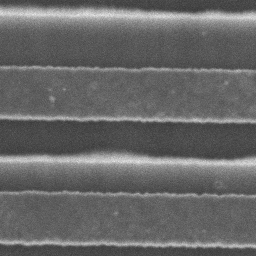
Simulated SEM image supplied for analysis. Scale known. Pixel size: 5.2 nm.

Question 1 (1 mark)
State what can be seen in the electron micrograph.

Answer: lines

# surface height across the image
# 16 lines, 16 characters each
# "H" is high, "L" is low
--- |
LLLLLLLLLLLLLLLL
HHHHHHHHHHHHHHHH
HHHHHHHHHHHHHHHH
HHHHHHHHHHHHHHHH
HHHHHHHHHHHHHHHH
HHHHHHHHHHHHHHHH
HHHHHHHHHHHHHHHH
LLLLLLLLLHHHHHHH
LLLLLLLLLLLLLLLL
LLLLLLLLLLLLLLLL
HHHHHHHHHHHHHHHH
HHHHHHHHHHHHHHHH
HHHHHHHHHHHHHHHH
HHHHHHHHHHHHHHHH
HHHHHHHHHHHHHHHH
LLLLLLLLLLLLLLLL